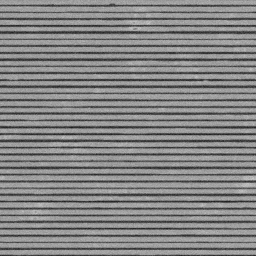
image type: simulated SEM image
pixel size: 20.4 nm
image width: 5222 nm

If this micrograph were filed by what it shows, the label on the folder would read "parallel lines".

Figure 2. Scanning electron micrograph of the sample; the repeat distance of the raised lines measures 6.76 px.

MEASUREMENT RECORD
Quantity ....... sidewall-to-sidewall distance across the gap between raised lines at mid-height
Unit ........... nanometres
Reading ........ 40.8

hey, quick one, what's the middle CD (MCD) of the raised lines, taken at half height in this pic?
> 94.4 nanometres